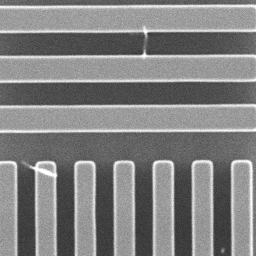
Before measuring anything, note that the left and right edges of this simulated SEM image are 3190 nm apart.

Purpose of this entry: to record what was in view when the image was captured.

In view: groups of lines, slits or small figures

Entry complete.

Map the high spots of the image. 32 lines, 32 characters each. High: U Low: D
DDDDDDDDDDDDDDDDDDDDDDDDDDDDDDDD
UUUUUUUUUUUUUUUUUUUUUUUUUUUUUUUU
UUUUUUUUUUUUUUUUUUUUUUUUUUUUUUUU
UUUUUUUUUUUUUUUUUUUUUUUUUUUUUUUU
DDDDDDDDDDDDDDDDDDDDDDDDDDDDDDDD
DDDDDDDDDDDDDDDDDDDDDDDDDDDDDDDD
DDDDDDDDDDDDDDDDDDDDDDDDDDDDDDDD
UUUUUUUUUUUUUUUUUUUUUUUUUUUUUUUU
UUUUUUUUUUUUUUUUUUUUUUUUUUUUUUUU
UUUUUUUUUUUUUUUUUUUUUUUUUUUUUUUU
DDDDDDDDDDDDDDDDDDDDDDDDDDDDDDDD
DDDDDDDDDDDDDDDDDDDDDDDDDDDDDDDD
DDDDDDDDDDDDDDDDDDDDDDDDDDDDDDDD
UUUUUUUUUUUUUUUUUUUUUUUUUUUUUUUU
UUUUUUUUUUUUUUUUUUUUUUUUUUUUUUUU
UUUUUUUUUUUUUUUUUUUUUUUUUUUUUUUU
DDDDDDDDDDDDDDDDDDDDDDDDDDDDDDDD
DDDDDDDDDDDDDDDDDDDDDDDDDDDDDDDD
DDDDDDDDDDDDDDDDDDDDDDDDDDDDDDDD
DDDDDDDDDDDDDDDDDDDDDDDDDDDDDDDD
UUDDDUUDDDUUDDUUUDDUUUDDUUDDDUUD
UUDDUUUDDUUUDDUUUDDUUUDDUUUDDUUD
UUDDUUUDDUUUDDUUUDDUUUDDUUUDDUUD
UUDDUUUDDUUUDDUUUDDUUUDDUUUDDUUD
UUDDUUUDDUUUDDUUUDDUUUDDUUUDDUUD
UUDDUUUDDUUUDDUUUDDUUUDDUUUDDUUD
UUDDUUUDDUUUDDUUUDDUUUDDUUUDDUUD
UUDDUUUDDUUUDDUUUDDUUUDDUUUDDUUD
UUDDUUUDDUUUDDUUUDDUUUDDUUUDDUUD
UUDDDUUDDUUUDDUUUDDUUUDDUUUDDUUD
UUDDDUUDDUUUDDUUUDDUUUDDUUUDDUUD
UUDDDUUDDUUUDDUUUDDUUUDDUUUDDUUD